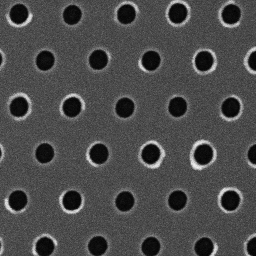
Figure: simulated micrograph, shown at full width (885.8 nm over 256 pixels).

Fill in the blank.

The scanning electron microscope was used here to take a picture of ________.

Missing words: a regular array of holes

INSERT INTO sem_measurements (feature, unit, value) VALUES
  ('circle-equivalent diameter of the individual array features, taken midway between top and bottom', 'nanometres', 67.9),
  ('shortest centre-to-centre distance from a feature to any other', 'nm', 182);